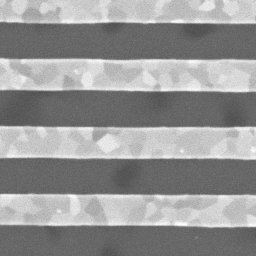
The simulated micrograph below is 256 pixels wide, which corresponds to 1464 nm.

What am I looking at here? wiring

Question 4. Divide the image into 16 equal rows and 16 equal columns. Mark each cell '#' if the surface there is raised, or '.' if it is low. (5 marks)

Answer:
################
................
................
................
################
################
................
................
################
################
................
................
################
################
................
................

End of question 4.